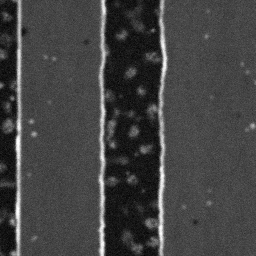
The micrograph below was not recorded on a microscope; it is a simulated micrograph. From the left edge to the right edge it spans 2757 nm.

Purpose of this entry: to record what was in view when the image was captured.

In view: one or a few lines or trenches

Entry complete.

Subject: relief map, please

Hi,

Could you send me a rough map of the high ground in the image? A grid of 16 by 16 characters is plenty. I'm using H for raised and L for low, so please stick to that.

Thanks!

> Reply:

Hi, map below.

HLLLLLHHHHLLLLLL
HLLLLLHHHHLLLLLL
HLLLLLHHHHLLLLLL
HLLLLLHHHHLLLLLL
HLLLLLHHHHLLLLLL
HLLLLLHHHHLLLLLL
HLLLLLHHHHLLLLLL
HLLLLLHHHHLLLLLL
HLLLLLHHHHLLLLLL
HLLLLLHHHHLLLLLL
HLLLLLHHHHLLLLLL
HLLLLLHHHHLLLLLL
HLLLLLHHHHLLLLLL
HLLLLLHHHHLLLLLL
HLLLLLHHHHLLLLLL
HLLLLLHHHHLLLLLL